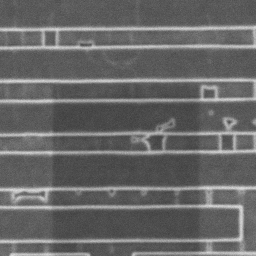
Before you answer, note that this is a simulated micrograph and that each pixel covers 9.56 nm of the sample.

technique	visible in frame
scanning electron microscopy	wiring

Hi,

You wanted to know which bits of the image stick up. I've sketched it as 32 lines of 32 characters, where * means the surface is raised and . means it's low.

********************************
********************************
********************************
***************************.....
................................
................................
********************************
********************************
********************************
********************************
................................
................................
............................****
********************************
********************************
********************************
********************************
................................
................................
********************************
********************************
********************************
********************************
*************************.......
................................
................................
******************************..
******************************..
******************************..
******************************..
................................
................................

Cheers